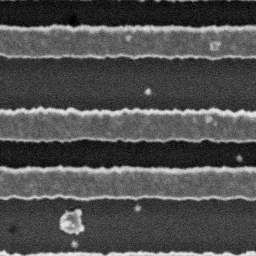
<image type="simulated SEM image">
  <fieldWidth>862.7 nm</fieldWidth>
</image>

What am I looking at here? lines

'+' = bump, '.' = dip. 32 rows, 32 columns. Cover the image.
................................
................................
................................
++++++++++++++++++++++++.+++++++
++++++++++++++++++++++++++++++++
++++++++++++++++++++++++++++++++
++++++++++++++++++++++++++++++++
................................
................................
................................
................................
................................
................................
................................
++++++++++++++++++++++++++++++++
++++++++++++++++++++++++++++++++
++++++++++++++++++++++++++++++++
.++++++++...+++++++++..++.++++++
................................
................................
................................
++++++++++++++++++++++++++++++++
++++++++++++++++++++++++++++++++
++++++++++++++++++++++++++++++++
++++++++++++++++++++++++++++++++
................................
................................
................................
................................
................................
................................
...............................+